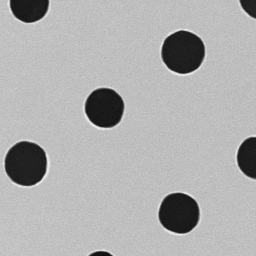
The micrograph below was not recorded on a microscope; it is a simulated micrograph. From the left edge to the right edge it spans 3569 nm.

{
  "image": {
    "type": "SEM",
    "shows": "holes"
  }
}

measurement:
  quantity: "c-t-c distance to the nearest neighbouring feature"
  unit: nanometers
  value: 1340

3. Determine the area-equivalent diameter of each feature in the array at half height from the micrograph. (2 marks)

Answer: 584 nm